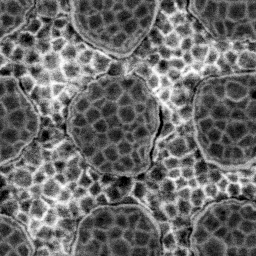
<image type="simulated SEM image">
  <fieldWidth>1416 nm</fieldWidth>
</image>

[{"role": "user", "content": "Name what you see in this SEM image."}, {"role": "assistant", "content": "raised bodies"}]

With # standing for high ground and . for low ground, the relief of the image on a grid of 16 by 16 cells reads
##...#####..####
#....#####...###
.....####.....##
................
................
#....####...####
##..######..####
##..######..####
##..######..####
#....####....###
......###.......
................
..............#.
.....####....###
##...#####..####
##...#####..####